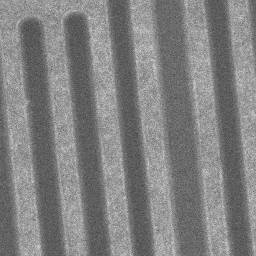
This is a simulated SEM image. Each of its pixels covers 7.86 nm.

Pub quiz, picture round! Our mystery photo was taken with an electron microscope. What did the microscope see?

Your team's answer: parallel lines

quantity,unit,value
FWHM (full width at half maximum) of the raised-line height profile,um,0.182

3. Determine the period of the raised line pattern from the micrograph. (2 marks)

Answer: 370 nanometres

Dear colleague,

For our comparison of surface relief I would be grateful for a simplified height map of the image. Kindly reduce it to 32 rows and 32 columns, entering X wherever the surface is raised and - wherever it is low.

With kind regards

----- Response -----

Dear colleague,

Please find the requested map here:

XXXXXXXXXXXXX---XXX----XXX--XXX-
XXXXXXXXXXXXXX--XXX----XXX---XX-
XXX--XXX---XXX--XXX----XXX---XX-
XX---XXX---XXX--XXX----XXX---XX-
XXX--XXX---XXX--XXX----XXX---XXX
XXX---XX---XXX---XX----XXX---XXX
XXX---XX---XXX---XXX----XX---XXX
XXX---XXX--XXX---XXX----XX---XXX
XXX---XXX--XXX---XXX----XXX--XXX
XXX---XXX--XXX---XXX----XXX--XXX
XXX---XXX---XX---XXX----XXX--XXX
XXX---XXX---XXX--XXX----XXX--XXX
-XXX--XXX---XXX--XXX----XXX---XX
-XXX--XXX---XXX--XXX----XXX---XX
-XXX--XXX---XXX--XXX----XXX---XX
-XXX---XX---XXX---XX----XXX---XX
-XXX---XX---XXX---XXX----XX---XX
-XXX---XX---XXX---XXX----XX---XX
-XXX---XXX--XXX---XXX----XXX--XX
-XXX---XXX---XXX--XXX----XXX--XX
-XXX---XXX---XXX--XXX----XXX--XX
-XXX---XXX---XXX--XXX----XXX--XX
--XX---XXX---XXX--XXX----XXX---X
--XX---XXX---XXX--XXX----XXX---X
--XXX--XXX---XXX--XXX----XXX---X
--XXX---XX---XXX---XX----XXX---X
--XXX---XXX--XXX---XXX----XX---X
--XXX---XXX--XXX---XXX----XX---X
--XXX---XXX--XXX---XXX----XXX--X
--XXX---XXX---XXX--XXX----XXX--X
--XXX---XXX---XXX--XXX----XXX--X
--XXX---XXX---XXX--XXX----XXX--X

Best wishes